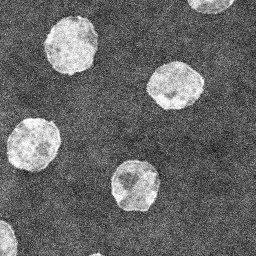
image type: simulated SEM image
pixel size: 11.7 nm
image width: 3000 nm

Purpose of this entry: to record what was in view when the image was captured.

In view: raised bodies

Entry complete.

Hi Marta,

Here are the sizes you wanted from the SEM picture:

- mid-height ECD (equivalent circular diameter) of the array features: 595 nm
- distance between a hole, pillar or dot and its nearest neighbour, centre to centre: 1250 nm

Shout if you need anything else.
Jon